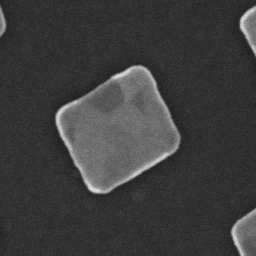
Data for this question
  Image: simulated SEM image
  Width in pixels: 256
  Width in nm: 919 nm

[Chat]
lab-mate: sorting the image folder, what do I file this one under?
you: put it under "raised bodies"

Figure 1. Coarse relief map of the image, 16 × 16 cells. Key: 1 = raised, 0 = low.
0000000000000000
0000000000000001
0000000000000001
0000000000000000
0000000010000000
0000001111000000
0000111111000000
0000111111100000
0000111111100000
0000111111100000
0000011110000000
0000011100000000
0000000000000000
0000000000000001
0000000000000001
0000000000000001